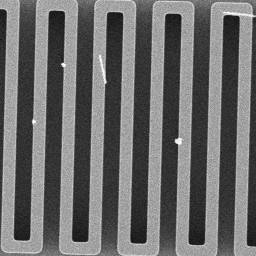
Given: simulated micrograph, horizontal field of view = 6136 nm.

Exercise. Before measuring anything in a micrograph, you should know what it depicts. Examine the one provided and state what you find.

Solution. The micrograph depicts groups of lines, slits or small figures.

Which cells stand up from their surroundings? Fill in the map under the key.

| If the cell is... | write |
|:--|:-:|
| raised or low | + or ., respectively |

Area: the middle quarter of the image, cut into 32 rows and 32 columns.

+++....+++.....+++....+++....+++
+++....+++.....+++....+++....+++
+++....+++.....+++....+++....+++
+++....+++.....+++....+++....+++
+++....+++....++++....+++....+++
+++....+++....+++.....+++....+++
+++....+++....+++.....+++....+++
+++....+++....+++.....+++....+++
+++....+++....+++.....+++....+++
+++....+++....+++.....+++....+++
+++....+++....+++.....+++....+++
+++....+++....+++.....+++....+++
+++....+++....+++.....+++....+++
+++....+++....+++.....++.....+++
+++....+++....+++.....++.....+++
+++....+++....+++.....++.....+++
+++....+++....+++.....++.....+++
+++....+++....+++.....++.....+++
+++....+++....+++.....++.....+++
+++....+++....+++.....++....++++
+++....+++....+++.....++.....+++
+++....+++....+++....+++.....+++
++.....+++....+++....+++.....++.
++.....+++....+++....+++.....++.
++.....+++....+++....+++.....++.
++.....+++....+++....+++.....++.
++.....+++....+++....+++.....++.
++.....+++....+++....+++.....++.
++.....+++....+++....+++.....++.
++.....+++....+++....+++.....++.
++.....++.....+++....+++....+++.
++.....++.....+++....+++....+++.